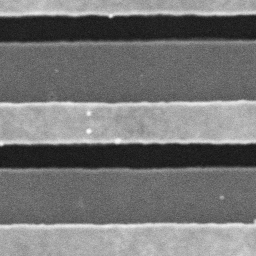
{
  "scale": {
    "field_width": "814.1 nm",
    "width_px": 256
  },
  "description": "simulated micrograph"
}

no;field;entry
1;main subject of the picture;lines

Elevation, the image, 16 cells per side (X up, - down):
XXXXXXXXXXXXXXXX
----------------
----------------
XXXXXXXXXXXXXXXX
XXXXXXXXXXXXXXXX
XXXXXXXXXXXXXXXX
XXXXXXXXXXXXXXXX
XXXXXXXXXXXXXXXX
XXXXXXXXXXXXXXXX
----------------
----------------
XXXXXXXXXXXXXXXX
XXXXXXXXXXXXXXXX
XXXXXXXXXXXXXXXX
XXXXXXXXXXXXXXXX
XXXXXXXXXXXXXXXX